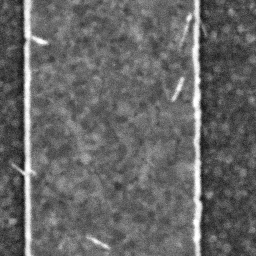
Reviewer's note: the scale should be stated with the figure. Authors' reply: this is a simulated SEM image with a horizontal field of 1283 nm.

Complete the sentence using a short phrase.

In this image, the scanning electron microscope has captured one or a few lines or trenches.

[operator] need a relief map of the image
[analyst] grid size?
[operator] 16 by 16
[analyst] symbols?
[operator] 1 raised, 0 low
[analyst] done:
0011111111110000
0011111111110000
0011111111110000
0011111111110000
0011111111110000
0011111111110000
0011111111110000
0011111111110000
0011111111110000
0011111111110000
0011111111110000
0011111111110000
0011111111110000
0011111111110000
0011111111110000
0011111111110000